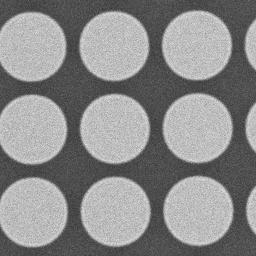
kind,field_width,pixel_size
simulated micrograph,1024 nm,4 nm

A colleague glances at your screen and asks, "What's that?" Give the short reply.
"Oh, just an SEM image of an array of small figures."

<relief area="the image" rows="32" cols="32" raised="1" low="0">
00000000000000000000000000000000
00000000000001100000000111000000
01111110000111111000001111110000
11111111000111111100011111110001
11111111001111111100111111111001
11111111001111111110111111111001
11111111001111111110111111111001
11111111001111111100011111111001
11111110000111111100011111110000
00111100000011111000000111100000
00000000000000000000000000000000
00000000000000000000000000000000
00111100000011111000001111100000
01111110000111111100011111110001
11111111001111111100011111111001
11111111001111111110111111111001
11111111001111111110111111111001
11111111001111111100011111111001
11111111000111111100011111110000
01111110000011111000001111100000
00011000000000000000000000000000
00000000000000000000000000000000
00011100000001110000000111100000
01111110000111111100001111110000
11111111000111111100011111111001
11111111001111111110011111111001
11111111001111111110111111111001
11111111001111111110011111111001
11111111000111111100011111111001
01111110000111111100001111110000
00111100000001110000000111000000
00000000000000000000000000000000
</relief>